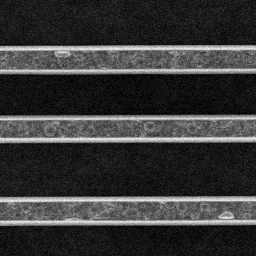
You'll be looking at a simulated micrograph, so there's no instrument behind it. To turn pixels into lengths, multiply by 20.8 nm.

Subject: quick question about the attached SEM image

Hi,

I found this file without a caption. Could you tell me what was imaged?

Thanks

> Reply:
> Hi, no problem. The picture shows one or a few lines or trenches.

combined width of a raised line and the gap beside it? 1.57 microns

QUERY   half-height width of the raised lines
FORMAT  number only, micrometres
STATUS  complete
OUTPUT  0.513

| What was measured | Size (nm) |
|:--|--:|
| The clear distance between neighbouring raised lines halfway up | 1060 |